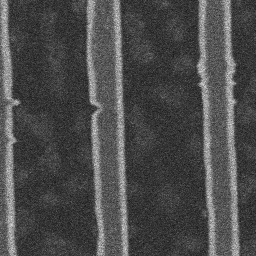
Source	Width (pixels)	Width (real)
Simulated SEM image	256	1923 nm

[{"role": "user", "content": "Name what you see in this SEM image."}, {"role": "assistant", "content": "one or a few lines or trenches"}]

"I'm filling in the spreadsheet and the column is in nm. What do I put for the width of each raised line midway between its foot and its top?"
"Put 199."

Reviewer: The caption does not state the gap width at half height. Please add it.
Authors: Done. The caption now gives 0.638 micrometres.